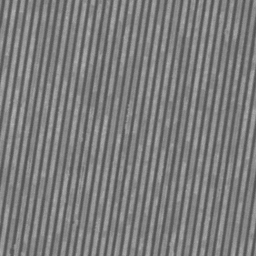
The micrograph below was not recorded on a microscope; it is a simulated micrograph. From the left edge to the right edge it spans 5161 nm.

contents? parallel lines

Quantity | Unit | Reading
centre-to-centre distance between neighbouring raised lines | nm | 154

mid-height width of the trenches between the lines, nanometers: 79.7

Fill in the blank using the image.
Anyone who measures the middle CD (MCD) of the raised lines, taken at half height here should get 0.0772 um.